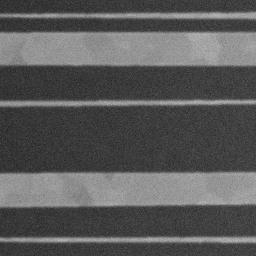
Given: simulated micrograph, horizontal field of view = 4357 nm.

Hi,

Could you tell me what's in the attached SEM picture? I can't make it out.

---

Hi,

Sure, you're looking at lines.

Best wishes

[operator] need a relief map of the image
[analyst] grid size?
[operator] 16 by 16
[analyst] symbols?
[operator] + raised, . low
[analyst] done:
................
................
++++++++++++++++
++++++++++++++++
................
................
................
................
................
................
................
++++++++++++++++
++++++++++++++++
................
................
................